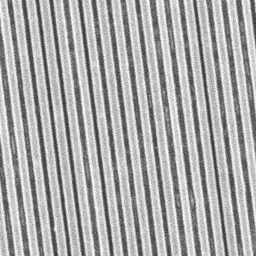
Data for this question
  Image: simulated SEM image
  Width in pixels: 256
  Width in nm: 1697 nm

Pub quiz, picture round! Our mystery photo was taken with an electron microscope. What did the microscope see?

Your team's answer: parallel lines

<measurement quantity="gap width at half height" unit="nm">37.8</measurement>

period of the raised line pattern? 94.1 nm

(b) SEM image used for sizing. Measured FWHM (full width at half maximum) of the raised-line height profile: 56.8 nm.